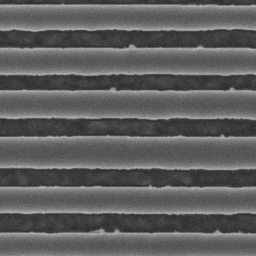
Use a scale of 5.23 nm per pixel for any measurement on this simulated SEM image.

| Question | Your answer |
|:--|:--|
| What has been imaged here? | lines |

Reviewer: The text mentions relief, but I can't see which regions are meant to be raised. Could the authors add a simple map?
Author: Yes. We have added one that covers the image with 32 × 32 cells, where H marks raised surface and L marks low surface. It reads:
LLLLLLLLLLLLLLLLLLLLLLLLLLLLLLLL
HHHHHHHHHHHHHHHHHHHHHHHHHHHHHHHH
HHHHHHHHHHHHHHHHHHHHHHHHHHHHHHHH
HHHHHHHHHHHHHHHHHHHHHHHHHHHHHHHH
LLLLLLLLLLLLLLLLLLLLLLLLLLLLLLLL
LLLLLLLLLLLLLLLLLLLLLLLLLLLLLLLL
HHHHHHHHHHHHHHHHHHHHHHHHHHHHHHHH
HHHHHHHHHHHHHHHHHHHHHHHHHHHHHHHH
HHHHHHHHHHHHHHHHHHHHHHHHHHHHHHHH
LLLLLLLLLLLLLLLLLLLLLLLLLLLLLLLL
LLLLLLLLLLLLLLLLLLLLLLLLLLLLLLLL
HHHHHHHHHHHHHHHHHHHHHHHHHHHHHHHH
HHHHHHHHHHHHHHHHHHHHHHHHHHHHHHHH
HHHHHHHHHHHHHHHHHHHHHHHHHHHHHHHH
HHHHHHHHHHHHHHHHHHHHHHHHHHHHHHHH
LLLLLLLLLLLLLLLLLLLLLLLLLLLLLLLL
LLLLLLLLLLLLLLLLLLLLLLLLLLLLLLLL
HHHHHHHHHHHHHHHHHHHHHHHHHHHHHHHH
HHHHHHHHHHHHHHHHHHHHHHHHHHHHHHHH
HHHHHHHHHHHHHHHHHHHHHHHHHHHHHHHH
HHHHHHHHHHHHHHHHHHHHHHHHHHHHHHHH
LLLLLLLLLLLLLLLLLLLLLLLLLLLLLLLL
LLLLLLLLLLLLLLLLLLLLLLLLLLLLLLLL
HHHHHHHHHHHHHHHHHHHHHHHHHHHHHLHH
HHHHHHHHHHHHHHHHHHHHHHHHHHHHHHHH
HHHHHHHHHHHHHHHHHHHHHHHHHHHHHHHH
HHHHHHHHHHHHHHHHHHHHHHHHHHHHHHHH
LLLLLLLLLLLLLLLLLLLLLLLLLLLLLLLL
LLLLLLLLLLLLLLLLLLLLLLLLLLLLLLLL
HHHHHHHHHHHHHHHHHHHHHHHHHHHHHHHH
HHHHHHHHHHHHHHHHHHHHHHHHHHHHHHHH
HHHHHHHHHHHHHHHHHHHHHHHHHHHHHHHH